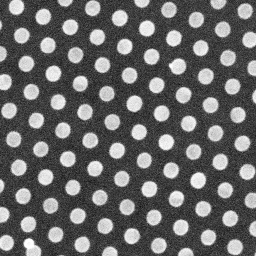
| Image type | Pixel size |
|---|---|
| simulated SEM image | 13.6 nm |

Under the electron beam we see a regular array of raised bodies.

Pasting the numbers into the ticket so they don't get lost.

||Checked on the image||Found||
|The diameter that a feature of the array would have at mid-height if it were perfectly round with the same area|194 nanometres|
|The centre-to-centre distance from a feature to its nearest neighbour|388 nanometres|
